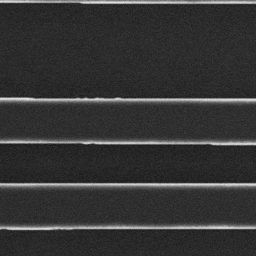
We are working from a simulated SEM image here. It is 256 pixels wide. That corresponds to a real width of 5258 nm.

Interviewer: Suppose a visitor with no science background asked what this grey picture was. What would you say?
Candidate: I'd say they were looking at lines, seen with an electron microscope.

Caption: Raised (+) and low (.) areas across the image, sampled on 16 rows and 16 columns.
................
................
................
................
................
................
++++++++++++++++
++++++++++++++++
++++++++++++++++
................
................
................
++++++++++++++++
++++++++++++++++
................
................